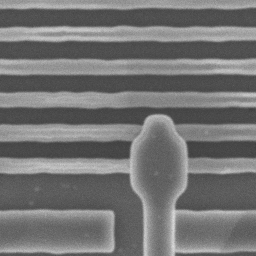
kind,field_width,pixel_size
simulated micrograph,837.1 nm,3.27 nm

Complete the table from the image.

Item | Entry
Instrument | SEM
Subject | wiring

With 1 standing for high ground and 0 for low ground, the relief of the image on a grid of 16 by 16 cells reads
0000000000000000
0000000000000000
0000000000000000
0000000000000000
0000000000000000
0000000000000000
0000000000000000
0000000001100000
0000000001100000
0000000011110000
0000000011110000
0000000011110000
0000000001100000
0000000001100000
0000000001100000
0000000001100000